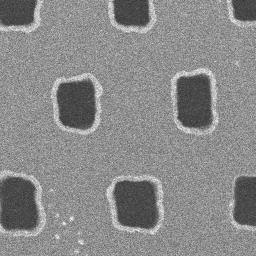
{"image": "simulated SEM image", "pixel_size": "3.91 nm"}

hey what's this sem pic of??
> holes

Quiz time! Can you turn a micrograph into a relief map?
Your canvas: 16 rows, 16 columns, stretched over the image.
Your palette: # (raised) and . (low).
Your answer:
..#####..######.
..######.#######
################
################
################
####..#####..###
####..#####..###
####..#####..###
################
################
################
..#####..######.
..#####...#####.
..#####...#####.
################
################